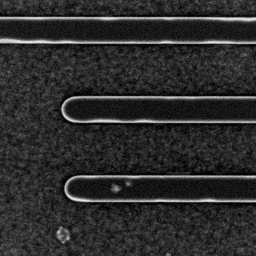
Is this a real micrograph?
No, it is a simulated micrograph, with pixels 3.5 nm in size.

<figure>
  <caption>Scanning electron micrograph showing groups of lines, slits or small figures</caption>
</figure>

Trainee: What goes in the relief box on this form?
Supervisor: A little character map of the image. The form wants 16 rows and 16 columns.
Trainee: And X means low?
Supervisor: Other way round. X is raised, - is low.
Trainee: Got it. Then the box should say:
----------------
XXXXXXXXXXXXXXXX
XXXXXXXXXXXXXXXX
----------------
----------------
----------------
----XXXXXXXXXXXX
----XXXXXXXXXXXX
----------------
----------------
----------------
----XXXXXXXXXXXX
-----XXXXXXXXXXX
----------------
----------------
----------------